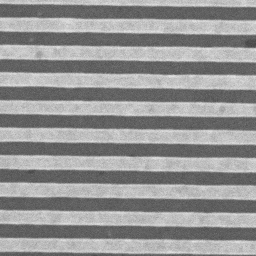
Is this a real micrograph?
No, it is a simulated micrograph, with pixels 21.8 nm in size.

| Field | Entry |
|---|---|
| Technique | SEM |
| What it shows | wiring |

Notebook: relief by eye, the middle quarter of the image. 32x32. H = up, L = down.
LLLLLLLLLLLLLLLLLLLLLLLLLLLLLLLL
LLLLLLLLLLLLLLLLLLLLLLLLLLLLLLLL
HHHHHLLLLLLLLLLLLLLLLLLLLLLLLLLL
HHHHHHHHHHHHHHHHHHHHHHHHHHHHHHHH
HHHHHHHHHHHHHHHHHHHHHHHHHHHHHHHH
HHHHHHHHHHHHHHHHHHHHHHHHHHHHHHHH
LLLLLLLLLLLLLLLLLLLLLLLLLLLLLLLL
LLLLLLLLLLLLLLLLLLLLLLLLLLLLLLLL
LLLLLLLLLLLLLLLLLLLLLLLLLLLLLLLL
HHHHHLLLLLLLLLLLLLLLLLLLLLLLLLLL
HHHHHHHHHHHHHHHHHHHHHHHHHHHHHHHH
HHHHHHHHHHHHHHHHHHHHHHHHHHHHHHHH
HHHHHHHHHHHHHHHHHHHHHHHHHHHHHHHH
LLLLLLLLLLLLLLLLLLLLLLLLLLLLLLLL
LLLLLLLLLLLLLLLLLLLLLLLLLLLLLLLL
LLLLLLLLLLLLLLLLLLLLLLLLLLLLLLLL
HHHHHHHHHHHHHHHHHHHHHHHHHHHHLLLL
HHHHHHHHHHHHHHHHHHHHHHHHHHHHHHHH
HHHHHHHHHHHHHHHHHHHHHHHHHHHHHHHH
LLLLLLLLLLLLLHHHHHHHHHHHHHHHHHHH
LLLLLLLLLLLLLLLLLLLLLLLLLLLLLLLL
LLLLLLLLLLLLLLLLLLLLLLLLLLLLLLLL
LLLLLLLLLLLLLLLLLLLLLLLLLLLLLLLL
HHHHHHHHHHHHHHHHHHHHHHHHHHHHHLLL
HHHHHHHHHHHHHHHHHHHHHHHHHHHHHHHH
HHHHHHHHHHHHHHHHHHHHHHHHHHHHHHHH
LLLLLLLLLLLLLLLLLLHHHHHHHHHHHHHH
LLLLLLLLLLLLLLLLLLLLLLLLLLLLLLLL
LLLLLLLLLLLLLLLLLLLLLLLLLLLLLLLL
LLLLLLLLLLLLLLLLLLLLLLLLLLLLLLLL
HHHHHHHHHHHHHHHHHHHHHHHHHHHHHHHH
HHHHHHHHHHHHHHHHHHHHHHHHHHHHHHHH